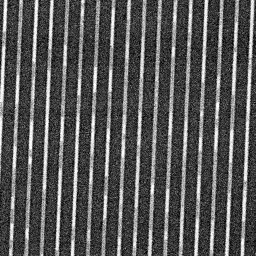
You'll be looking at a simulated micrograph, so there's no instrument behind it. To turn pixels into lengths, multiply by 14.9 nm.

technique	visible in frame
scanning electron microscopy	parallel lines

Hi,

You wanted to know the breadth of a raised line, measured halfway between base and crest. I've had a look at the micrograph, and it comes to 35.4 nm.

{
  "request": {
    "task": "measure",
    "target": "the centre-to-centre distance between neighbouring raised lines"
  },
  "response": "230 nm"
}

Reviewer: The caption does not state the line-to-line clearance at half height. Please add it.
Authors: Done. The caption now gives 194 nm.